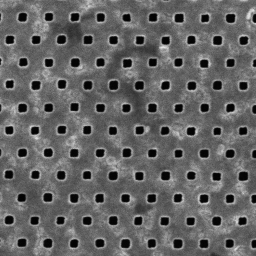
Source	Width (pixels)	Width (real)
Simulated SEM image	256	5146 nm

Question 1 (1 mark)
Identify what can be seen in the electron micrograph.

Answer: a regular array of holes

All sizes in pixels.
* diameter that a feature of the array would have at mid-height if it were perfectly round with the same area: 9.3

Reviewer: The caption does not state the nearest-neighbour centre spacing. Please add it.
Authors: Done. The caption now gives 25.5 px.